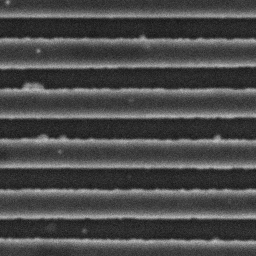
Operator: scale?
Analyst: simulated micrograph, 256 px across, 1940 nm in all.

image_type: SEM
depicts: lines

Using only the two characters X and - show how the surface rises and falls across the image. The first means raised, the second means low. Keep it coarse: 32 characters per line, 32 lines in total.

XXXXXXXXXXXXXXXXXXXXXXXXXXXXXXXX
XXXXXXXXXXXXXXXXXXXXXXXXXXXXXXXX
--------------------------------
--------------------------------
--------------------------------
XXXXXXXXXXXXXXXXXXXXXXXXXXXXXXXX
XXXXXXXXXXXXXXXXXXXXXXXXXXXXXXXX
XXXXXXXXXXXXXXXXXXXXXXXXXXXXXXXX
X-------------------------------
--------------------------------
--------------------------------
XXXXXXXXXXXXXXXXXXXXXXXXXXXXXXXX
XXXXXXXXXXXXXXXXXXXXXXXXXXXXXXXX
XXXXXXXXXXXXXXXXXXXXXXXXXXXXXXXX
XXXXXXXXXXXXXXXXXXXXXXXXXXXXXXXX
--------------------------------
--------------------------------
X-XX--X----X--------------------
XXXXXXXXXXXXXXXXXXXXXXXXXXXXXXXX
XXXXXXXXXXXXXXXXXXXXXXXXXXXXXXXX
XXXXXXXXXXXXXXXXXXXXXXXXXXXXXXXX
--------------------------------
--------------------------------
--------------------------------
XXXXXXXXXXXXXXXXXXXXXXXXXXXXXXXX
XXXXXXXXXXXXXXXXXXXXXXXXXXXXXXXX
XXXXXXXXXXXXXXXXXXXXXXXXXXXXXXXX
--------------------------------
--------------------------------
--------------------------------
XXXXXXXXXXXXXXXXXXXXXXXXXXXXXXXX
XXXXXXXXXXXXXXXXXXXXXXXXXXXXXXXX